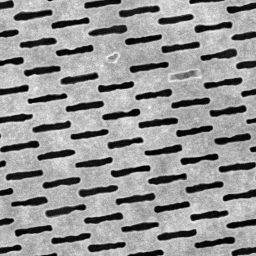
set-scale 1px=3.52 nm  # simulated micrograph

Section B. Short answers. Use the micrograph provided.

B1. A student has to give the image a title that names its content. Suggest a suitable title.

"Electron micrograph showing a regular array of holes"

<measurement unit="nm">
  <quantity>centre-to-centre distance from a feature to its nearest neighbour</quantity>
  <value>99.8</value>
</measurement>